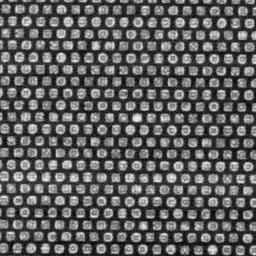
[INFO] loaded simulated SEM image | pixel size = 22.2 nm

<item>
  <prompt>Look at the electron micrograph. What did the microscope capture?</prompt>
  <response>a regular array of raised bodies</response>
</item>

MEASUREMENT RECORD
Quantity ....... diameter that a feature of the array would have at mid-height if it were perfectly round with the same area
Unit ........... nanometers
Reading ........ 186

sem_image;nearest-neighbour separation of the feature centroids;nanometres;298